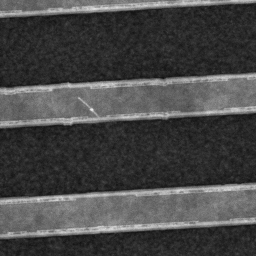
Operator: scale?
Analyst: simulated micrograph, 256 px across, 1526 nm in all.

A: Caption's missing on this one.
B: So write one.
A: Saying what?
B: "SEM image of one or a few lines or trenches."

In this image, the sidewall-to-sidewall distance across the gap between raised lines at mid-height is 453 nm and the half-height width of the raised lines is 0.204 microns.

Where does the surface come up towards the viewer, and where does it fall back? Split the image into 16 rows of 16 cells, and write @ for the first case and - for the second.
@@@@@@@---------
----------------
----------------
----------------
----------------
---@@@@@@@@@@@@@
@@@@@@@@@@@@@@@@
@@@@@-----------
----------------
----------------
----------------
----------------
-@@@@@@@@@@@@@@@
@@@@@@@@@@@@@@@@
@@@@------------
----------------